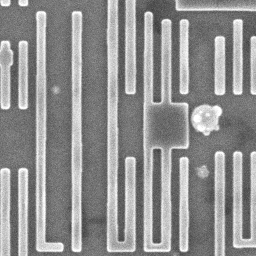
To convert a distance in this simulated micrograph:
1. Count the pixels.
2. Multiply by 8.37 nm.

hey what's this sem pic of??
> wiring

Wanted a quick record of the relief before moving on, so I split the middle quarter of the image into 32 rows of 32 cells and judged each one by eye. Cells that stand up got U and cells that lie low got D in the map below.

DDUUDDDDDDDUUDDDUUDDUUDDDUUDDUUD
DDUUDDDDDDDUUDDDUUDDUUDDDUUDDUUD
DDUUDDDDDDDUUDDDUUDDUUDDDUUDDUUD
DDUUDDDDDDDUUDDDUUDDUUDDDUUDDUUD
DDUUDDDDDDDUUDDDUUDDUUDDDDUDDUUD
DDUUDDDDDDDUUDDDUUDDUUDDDDUDDUUD
DDUUDDDDDDDUUDDDUUDDUUDDDUUDDUUD
DDUUDDDDDDDUUDDDDDDDUUDDDUUDDDDD
DDUUDDDDDDDUUDDDDDDDUUDDDUUDDDDD
DDUUDDDDDDDUUDDDDDDDUUDDUUUDDDDD
DDUUDDDDDDDUUDDDDDDDUUUUUUUUUUUD
DDUUDDDDDDDUUDDDDDDDUUUUUUUUUUUD
DDUUDDDDDDDUUDDDDDDDUUUUUUUUUUUD
DDUUDDDDDDDUUDDDDDDDUUUUUUUUUUUD
DDUUDDDDDDDUUDDDDDDDUUUUUUUUUUUD
DDUUDDDDDDDUUDDDDDDDUUUUUUUUUUUD
DDUUDDDDDDDUUDDDDDDDUUUUUUUUUUUD
DDUUDDDDDDDUUDDDDDDDUUUUUUUUUUUD
DDUUDDDDDDDUUDDDDDDDUUUUUUUUUUUD
DDUUDDDDDDDUUDDDDDDDUUUUUUUUUUUD
DDUUDDDDDDDUUDDDDDDDUUUUUUUUUUUD
DDUUDDDDDDDUUDDDDDDDUUDDUUUDDDDD
DDUUDDDDDDDUUDDDDDDDUUDDDUUDDDDD
DDUUDDDDDDDUUDDDUDDDUUDDDUUDDUUD
DDUUDDDDDDDUUDDDUUDDUDDDDUUDDUUD
DDUUDDDDDDDUUDDDUUDDUUDDDUUDDUUD
DDUUDDDDDDDUUDDDUUDDUUDDDUUDDUUD
DDUUDDDDDDDUUDDDUUDDUUDDDUUDDUUD
DDUUDDDDDDDUUDDDUUDDUUDDDUDDDUUD
DDUUDDDDDDDUUDDDUUDDUUDDDUDDDUUD
DDUUDDDDDDDUUDDDUUDDUUDDDUDDDUUD
DDUUDDDDDDDUUDDDUUDDUUDDDUDDDUUD